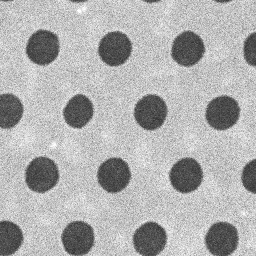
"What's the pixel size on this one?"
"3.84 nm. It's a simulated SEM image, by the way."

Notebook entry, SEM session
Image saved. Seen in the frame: a regular array of holes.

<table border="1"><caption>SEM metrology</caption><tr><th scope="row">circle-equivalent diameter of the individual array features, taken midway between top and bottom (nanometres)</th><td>134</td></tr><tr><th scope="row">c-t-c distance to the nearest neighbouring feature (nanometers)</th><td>277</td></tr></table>